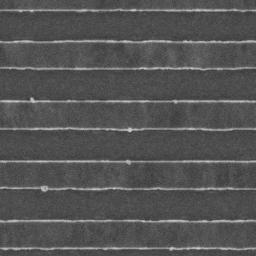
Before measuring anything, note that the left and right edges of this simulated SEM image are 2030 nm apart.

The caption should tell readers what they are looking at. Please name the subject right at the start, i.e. lines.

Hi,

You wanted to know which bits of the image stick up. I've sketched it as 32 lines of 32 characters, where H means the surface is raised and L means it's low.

HHHHHHHHHHHHHHHHHHHHHHHHHHHHHHHH
LLLLLLLLLLLLLLLLLLLLLLLLLLLLLLLL
LLLLLLLLLLLLLLLLLLLLLLLLLLLLLLLL
LLLLLLLLLLLLLLLLLLLLLLLLLLLLLLLL
LLLLLLLLLLLLLLLLLLLLLLLLLLLLLLLL
HHHHHHHHHHHHHHHHHHHHHHHHHHHHHHHH
HHHHHHHHHHHHHHHHHHHHHHHHHHHHHHHH
HHHHHHHHHHHHHHHHHHHHHHHHHHHHHHHH
LHHHHHHHHHHHHHHHHHHHHHHHHHHHHHHL
LLLLLLLLLLLLLLLLLLLLLLLLLLLLLLLL
LLLLLLLLLLLLLLLLLLLLLLLLLLLLLLLL
LLLLLLLLLLLLLLLLLLLLLLLLLLLLLLLL
LLLLLLLLLLLLLLLLLLLLLLLLLLLLLLLL
HHHHHHHHHHHHHHHHHHHHHHHHHHHHHHHH
HHHHHHHHHHHHHHHHHHHHHHHHHHHHHHHH
HHHHHHHHHHHHHHHHHHHHHHHHHHHHHHHH
LLLLLLLLLLLLLLLLLLLLLLLLLLLLLLLL
LLLLLLLLLLLLLLLLLLLLLLLLLLLLLLLL
LLLLLLLLLLLLLLLLLLLLLLLLLLLLLLLL
LLLLLLLLLLLLLLLLLLLLLLLLLLLLLLLL
HHHHHHHHHHHHHHHHHHHHHHHHHHHHHHHH
HHHHHHHHHHHHHHHHHHHHHHHHHHHHHHHH
HHHHHHHHHHHHHHHHHHHHHHHHHHHHHHHH
HHHHHHHHHHHHHHHHHHHHHHHHHHHHHHHH
LLLLLLLLLLLLLLLLLLLLLLLLLLLLLLLL
LLLLLLLLLLLLLLLLLLLLLLLLLLLLLLLL
LLLLLLLLLLLLLLLLLLLLLLLLLLLLLLLL
LLLLLLLLLLLLLLLLLLLLLLLLLLLLLLLL
HHHHHHHHHHHHHHHHHHHHHHHHHHHHHHHH
HHHHHHHHHHHHHHHHHHHHHHHHHHHHHHHH
HHHHHHHHHHHHHHHHHHHHHHHHHHHHHHHH
LLLLLLLLLLLLLLLLLLLLLLLLLLLLLLLL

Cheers